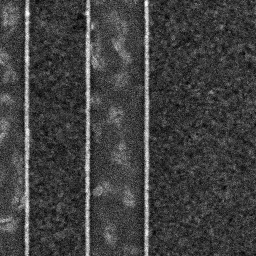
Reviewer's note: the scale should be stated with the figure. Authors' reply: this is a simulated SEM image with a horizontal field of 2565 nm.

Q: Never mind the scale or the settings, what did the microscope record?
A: one or a few lines or trenches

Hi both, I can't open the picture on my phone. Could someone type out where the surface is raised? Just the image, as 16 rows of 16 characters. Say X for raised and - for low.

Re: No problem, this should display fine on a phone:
--XXXX---XXXXXXX
--XXXX---XXXXXXX
--XXXX---XXXXXXX
--XXX----XXXXXXX
--XXX----XXXXXXX
--XXX----XXXXXXX
--XXX----XXXXXXX
--XXX----XXXXXXX
--XXX----XXXXXXX
--XXX----XXXXXXX
--XXX----XXXXXXX
--XXX----XXXXXXX
--XXX----XXXXXXX
--XXX----XXXXXXX
--XXX----XXXXXXX
--XXX----XXXXXXX